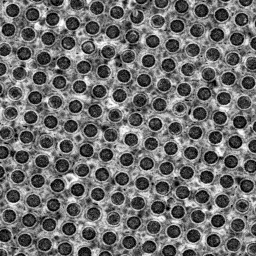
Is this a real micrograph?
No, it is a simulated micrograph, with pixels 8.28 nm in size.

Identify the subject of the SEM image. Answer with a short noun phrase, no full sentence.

a regular array of holes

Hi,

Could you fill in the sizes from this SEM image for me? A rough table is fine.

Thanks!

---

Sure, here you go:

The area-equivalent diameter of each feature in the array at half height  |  118 nm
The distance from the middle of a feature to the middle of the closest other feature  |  166 nm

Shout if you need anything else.